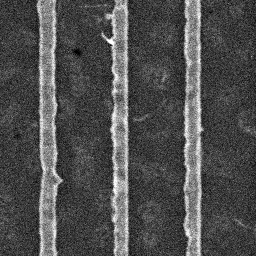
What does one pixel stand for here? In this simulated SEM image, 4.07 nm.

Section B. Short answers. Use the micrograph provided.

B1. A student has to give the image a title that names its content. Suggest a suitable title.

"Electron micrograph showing one or a few lines or trenches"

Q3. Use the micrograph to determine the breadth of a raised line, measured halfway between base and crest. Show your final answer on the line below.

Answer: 54.5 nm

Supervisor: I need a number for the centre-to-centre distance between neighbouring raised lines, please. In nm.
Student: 295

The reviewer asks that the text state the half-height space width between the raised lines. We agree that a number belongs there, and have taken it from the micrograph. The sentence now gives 0.24 micrometres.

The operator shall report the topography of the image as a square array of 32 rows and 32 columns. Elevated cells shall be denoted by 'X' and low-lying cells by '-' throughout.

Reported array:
-----XX-------XX-------XX-------
-----XX-------XX-------XX-------
-----XX-------XX-------XX-------
-----XX-------XX-------XX-------
-----XX-------XX-------XX-------
-----XX-------XX-------XX-------
-----XX-------XX-------XX-------
-----XX-------XX-------XX-------
-----XX-------XX-------XX-------
-----XX-------XX-------XX-------
-----XX-------XX-------XX-------
-----XX-------XX-------XX-------
-----XX-------XX-------XX-------
-----XX-------XX-------XX-------
-----XX-------XX-------XX-------
-----XX-------XX-------XX-------
-----XX-------XX-------XX-------
-----XX-------XX-------XX-------
-----XX-------XX-------XX-------
-----XX-------XX-------XX-------
-----XX-------XX-------XX-------
-----XX-------XX-------XX-------
-----XXX------XX-------XX-------
-----XX-------XX-------XX-------
-----XX-------XX-------XX-------
-----XX-------XX-------XX-------
-----XX-------XX-------XX-------
-----XX-------XX-------XX-------
-----XX-------XX-------XX-------
-----XX-------XX--------X-------
-----XX-------XX--------X-------
-----XX-------XX-------XX-------